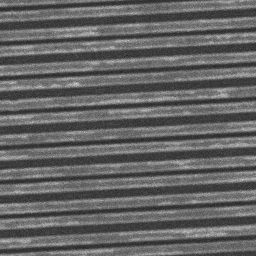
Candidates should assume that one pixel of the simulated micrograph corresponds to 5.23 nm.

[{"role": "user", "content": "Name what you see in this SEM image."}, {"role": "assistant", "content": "parallel lines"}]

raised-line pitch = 17.3 px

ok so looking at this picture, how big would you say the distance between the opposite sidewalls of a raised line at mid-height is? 48.3 nanometers